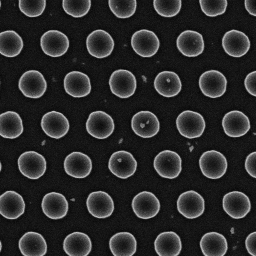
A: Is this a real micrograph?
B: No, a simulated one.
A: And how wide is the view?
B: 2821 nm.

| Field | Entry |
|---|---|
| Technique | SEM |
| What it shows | a regular array of raised bodies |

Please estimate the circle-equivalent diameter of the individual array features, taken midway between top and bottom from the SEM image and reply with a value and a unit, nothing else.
295 nanometers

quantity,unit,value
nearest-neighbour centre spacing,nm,497